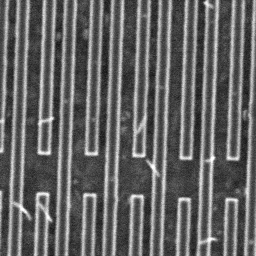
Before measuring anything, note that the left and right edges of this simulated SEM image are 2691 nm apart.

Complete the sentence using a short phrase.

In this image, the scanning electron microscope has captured parallel lines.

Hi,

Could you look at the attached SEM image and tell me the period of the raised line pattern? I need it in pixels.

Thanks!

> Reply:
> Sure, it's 23.9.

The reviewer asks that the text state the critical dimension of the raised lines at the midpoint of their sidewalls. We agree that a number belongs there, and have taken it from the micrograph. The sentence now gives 118 nm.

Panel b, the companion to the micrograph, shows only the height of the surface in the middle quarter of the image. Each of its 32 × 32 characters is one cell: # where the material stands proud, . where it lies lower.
##....###..###....###..###....##
##....###...##....###..###....##
##....###...##....###..###....##
##....###..###....###..###....##
##....###..###....###..###....##
##....###..###....###..###....##
##....###..###....###..###....##
##....###..###....###..###....##
##....###..###....###..###....##
##....###..###....##...###...###
##....###..###....##...###...###
##....###..###....##...###...###
##....###..###....##...###...###
##....###..###....##...##.....##
##....###..###....##...###....##
##....##...###....##...###...###
##....##...###....##...###...###
##....##...###....##...###...###
##....##...###....##...##....###
##....##...##.....##...##....###
##....##...##.....##...##....###
##....##...##.....##...##....###
##....##...##....###...##....###
##.........##..........##....###
##.........##.........###.......
##.........##.........###.......
#.........###.........###.......
#.........###.........###.......
#.........###.........###.......
#.........###.........###.......
#.........###.........###.......
#.........###.........###.......